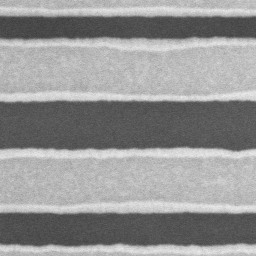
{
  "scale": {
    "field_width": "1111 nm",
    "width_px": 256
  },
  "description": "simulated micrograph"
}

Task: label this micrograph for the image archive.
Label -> lines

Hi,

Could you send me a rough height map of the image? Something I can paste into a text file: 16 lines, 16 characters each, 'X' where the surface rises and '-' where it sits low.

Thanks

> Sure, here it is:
XXXXXXXXXXXXXXXX
----------------
----------------
XXXXXXXXXXXXXXXX
XXXXXXXXXXXXXXXX
XXXXXXXXXXXXXXXX
----------------
----------------
----------------
-X------XXXXXX--
XXXXXXXXXXXXXXXX
XXXXXXXXXXXXXXXX
XXXXXXXXXXXXXXXX
----------------
----------------
XX-X-XXX--X---XX